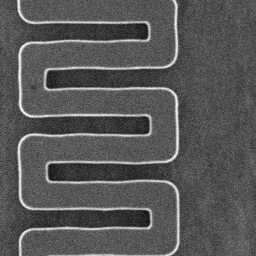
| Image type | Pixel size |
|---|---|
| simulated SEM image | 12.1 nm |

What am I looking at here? groups of lines, slits or small figures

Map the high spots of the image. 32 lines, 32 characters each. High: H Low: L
LLHHHHHHHHHHHHHHHHHHHHLLLLLLLLLL
LLHHHHHHHHHHHHHHHHHHHHLLLLLLLLLL
LLLHHHHHHHHHHHHHHHHHHHLLLLLLLLLL
LLLLLLLLLLLLLLLLLLLHHHLLLLLLLLLL
LLLLLLLLLLLLLLLLLLLHHHLLLLLLLLLL
LLLHHHHHHHHHHHHHHHHHHHLLLLLLLLLL
LLLHHHHHHHHHHHHHHHHHHHLLLLLLLLLL
LLLHHHHHHHHHHHHHHHHHHHLLLLLLLLLL
LLLHHHHHHLLLHHHHHLLLLLLLLLLLLLLL
LLLHHHLLLLLLLLLLLLLLLLLLLLLLLLLL
LLLHHHLLLLLLLLLLLLLLLLLLLLLLLLLL
LLLHHHHHHHHHHHHHHHHHHHLLLLLLLLLL
LLLHHHHHHHHHHHHHHHHHHHLLLLLLLLLL
LLLHHHHHHHHHHHHHHHHHHHLLLLLLLLLL
LLLLHHLLLLLLLLLLLLHHHHLLLLLLLLLL
LLLLLLLLLLLLLLLLLLLHHHLLLLLLLLLL
LLLLLLLLLLLLLLLLLLLHHHLLLLLLLLLL
LLLHHHHHHHHHHHHHHHHHHHLLLLLLLLLL
LLHHHHHHHHHHHHHHHHHHHHLLLLLLLLLL
LLHHHHHHHHHHHHHHHHHHHHLLLLLLLLLL
LLHHHHLLLLLLLLLLLLLLLLLLLLLLLLLL
LLLHHHLLLLLLLLLLLLLLLLLLLLLLLLLL
LLLHHHLLLLLLLLLLLLLLLLLLLLLLLLLL
LLLHHHHHHHHHHHHHHHHHHHLLLLLLLLLL
LLLHHHHHHHHHHHHHHHHHHHLLLLLLLLLL
LLLHHHHHHHHHHHHHHHHHHHLLLLLLLLLL
LLLLLLLLLLLLLLLLLLLHHHLLLLLLLLLL
LLLLLLLLLLLLLLLLLLLHHHLLLLLLLLLL
LLLLLLLLLLLLLHHHLLHHHHLLLLLLLLLL
LLLHHHHHHHHHHHHHHHHHHHLLLLLLLLLL
LLLHHHHHHHHHHHHHHHHHHHLLLLLLLLLL
LLLHHHHHHHHHHHHHHHHHHHLLLLLLLLLL